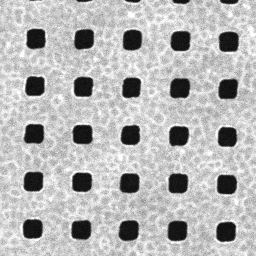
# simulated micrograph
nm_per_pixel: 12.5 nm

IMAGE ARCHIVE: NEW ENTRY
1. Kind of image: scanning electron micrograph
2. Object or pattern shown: a regular array of holes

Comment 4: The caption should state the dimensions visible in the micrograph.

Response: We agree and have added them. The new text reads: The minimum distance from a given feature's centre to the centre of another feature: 0.596 micrometres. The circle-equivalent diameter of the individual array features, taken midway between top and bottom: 270 nm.